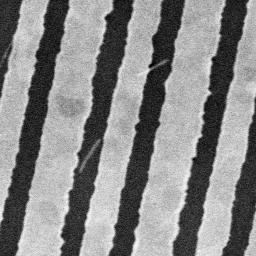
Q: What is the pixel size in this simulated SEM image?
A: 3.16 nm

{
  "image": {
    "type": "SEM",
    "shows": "lines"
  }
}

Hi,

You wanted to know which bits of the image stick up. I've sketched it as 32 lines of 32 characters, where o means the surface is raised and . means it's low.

...ooo...ooooo...ooo...ooooo...o
...ooo...ooooo...ooo...ooooo...o
..ooo...ooooo...oooo...ooooo...o
..ooo...ooooo...oooo..oooooo..oo
..ooo...ooooo...ooo...ooooo...oo
..ooo...ooooo...ooo...ooooo...oo
.oooo..ooooo....ooo...ooooo...oo
.oooo..ooooo...oooo...oooo...ooo
.ooo...ooooo...oooo...oooo...ooo
.ooo...ooooo...ooo...ooooo...ooo
oooo...oooo....ooo...ooooo...ooo
ooo...oooooo..oooo...ooooo...ooo
ooo...oooooo..oooo...ooooo..oooo
ooo...ooooo...ooo...ooooo...oooo
ooo...ooooo...ooo...ooooo...oooo
ooo..oooooo..oooo...ooooo...ooo.
ooo..ooooo...oooo...ooooo...ooo.
oo...ooooo...oooo..oooooo..oooo.
oo...ooooo...ooo...ooooo...oooo.
oo...ooooo...ooo...ooooo...oooo.
oo...ooooo..oooo...ooooo...ooo..
oo..ooooo...oooo...ooooo..oooo..
o...ooooo...oooo..oooooo..oooo..
o...ooooo...ooo...ooooo...ooo...
o...ooooo...ooo...ooooo...ooo...
o..oooooo..oooo...ooooo...ooo...
...ooooo...oooo..oooooo..oooo...
...ooooo...oooo..ooooo...oooo...
...ooooo...ooo...ooooo...oooo..o
...ooooo..oooo...ooooo...oooo..o
..oooooo..oooo...ooooo...ooo...o
..oooooo..oooo...ooooo..oooo...o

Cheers